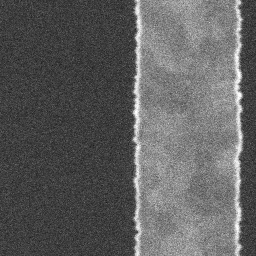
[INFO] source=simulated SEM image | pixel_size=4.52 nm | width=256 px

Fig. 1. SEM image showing one or a few lines or trenches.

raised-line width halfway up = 467 nm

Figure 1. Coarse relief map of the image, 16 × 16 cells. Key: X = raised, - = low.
---------XXXXXX-
---------XXXXXX-
---------XXXXXX-
---------XXXXXX-
---------XXXXXX-
--------XXXXXXX-
---------XXXXXX-
--------XXXXXXX-
--------XXXXXXX-
---------XXXXXX-
---------XXXXXX-
--------XXXXXXX-
---------XXXXXX-
---------XXXXXX-
---------XXXXXX-
---------XXXXXX-